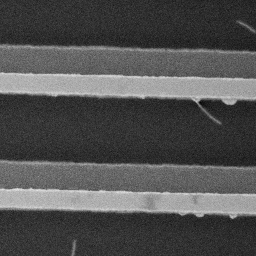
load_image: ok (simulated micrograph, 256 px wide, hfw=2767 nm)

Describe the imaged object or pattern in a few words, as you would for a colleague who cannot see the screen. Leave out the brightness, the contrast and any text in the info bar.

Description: lines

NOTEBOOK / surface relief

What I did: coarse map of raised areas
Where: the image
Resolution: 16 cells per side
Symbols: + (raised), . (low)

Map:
................
................
................
++++++++++++++++
++++++++++++++++
++++++++++++++++
................
................
................
................
++++++++++++++..
++++++++++++++++
++++++++++++++++
................
................
................